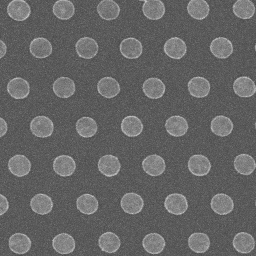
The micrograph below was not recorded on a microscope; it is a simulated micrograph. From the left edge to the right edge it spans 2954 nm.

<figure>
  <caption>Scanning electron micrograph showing a regular array of raised bodies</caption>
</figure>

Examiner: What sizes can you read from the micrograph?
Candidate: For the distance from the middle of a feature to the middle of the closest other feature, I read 513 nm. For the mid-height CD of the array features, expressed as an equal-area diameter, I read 245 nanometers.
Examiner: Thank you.